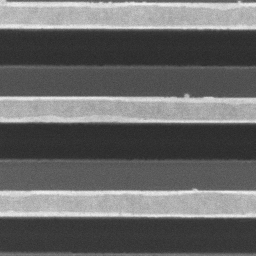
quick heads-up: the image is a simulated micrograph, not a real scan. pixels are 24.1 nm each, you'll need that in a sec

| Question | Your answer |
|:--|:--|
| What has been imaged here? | lines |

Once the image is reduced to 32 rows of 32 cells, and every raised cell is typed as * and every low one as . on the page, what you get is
********************************
********************************
********************************
********************************
................................
................................
................................
................................
********************************
********************************
********************************
********************************
********************************
********************************
********************************
................................
................................
................................
................................
................................
********************************
********************************
********************************
********************************
********************************
********************************
********************************
................................
................................
................................
................................
................................